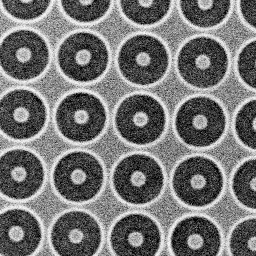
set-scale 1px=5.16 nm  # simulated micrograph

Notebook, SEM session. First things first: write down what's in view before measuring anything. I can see an array of small figures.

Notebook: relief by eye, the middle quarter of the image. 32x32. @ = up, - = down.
-----------@@@------------@@----
----------@@@@------@-----@@---@
----------@@@@@---@@@@@--@@@@-@@
@--------@@@@@@--@-@@@@-@@@@@@@@
@@@----@@@@@@@@@@------@@@@@@@@@
@@@@@@@@@@@@@@@@@@@@@@@@@@@@@@@@
@@@@@@@@@@@@@@@@@@@@@@@@@@@@@@@@
@------@@@@@@@@@@@--@@@@@@@@@@@@
---------@@@@@@--------@@@@@@@@@
---------@@@@@----------@@@@@@--
----------@@@@-----------@@@@---
----------@@@------------@@@----
---@@@-----@@-----@@-----@@@----
@@-@@@-----@@-----@@@-----@@----
---@@------@@-----@@@-----@@----
----------@@@------------@@@----
----------@@@------------@@@----
---------@@@@@-----------@@@----
--------@@@@@@@---------@@@@@---
@@----@@@@@@@@@@------@@@@@@@@--
@@@@@@@@@@@@@@@@@@@@@@@@@@@@@@@@
@@@@@@@@@@@@@@@@@@@@@@@@@@@@@@@@
-------@@@@@@@@@@---@@@@@@@@@@@@
--------@@@@@@@-------@@@@@@@@@-
---------@@@@@---------@@@@@@---
---------@@@@-----------@@@@----
----------@@@------------@@@----
--@@@-----@@-----@@@-----@@-----
--@@@-----@@-----@@@-----@@-----
---@@-----@@-----@@@-----@@-----
----------@@-------------@@-----
---------@@@@-----------@@@-----